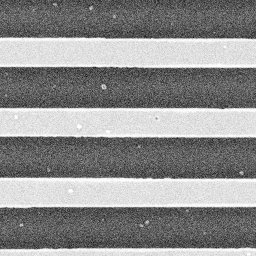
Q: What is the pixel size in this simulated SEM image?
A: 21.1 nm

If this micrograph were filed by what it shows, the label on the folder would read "lines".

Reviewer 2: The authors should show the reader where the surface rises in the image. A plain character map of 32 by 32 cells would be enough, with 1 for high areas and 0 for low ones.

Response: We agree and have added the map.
00000000000000000000000000000000
00000000000000000000000000000000
00000000000000000000000000000000
00000000000000000000000000000000
00000000000000000000000000000000
11111111111111111111111111111111
11111111111111111111111111111111
11111111111111111111111111111111
00000000000000000000000000000000
00000000000000000000000000000000
00000000000000000000000000000000
00000000000000000000000000000000
00000000000000000000000000000000
00000000000000000000000000000000
11111111111111111111111111111111
11111111111111111111111111111111
11111111111111111111111111111111
00000000000000000000000000000000
00000000000000000000000000000000
00000000000000000000000000000000
00000000000000000000000000000000
00000000000000000000000000000000
11111111111111111111111111111111
11111111111111111111111111111111
11111111111111111111111111111111
11111111111111111111111111111111
00000000000000000000000000000000
00000000000000000000000000000000
00000000000000000000000000000000
00000000000000000000000000000000
00000000000000000000000000000000
11111111111111111111111111111111